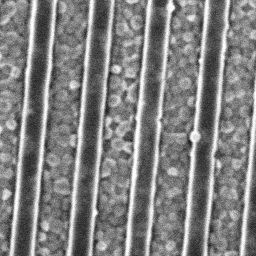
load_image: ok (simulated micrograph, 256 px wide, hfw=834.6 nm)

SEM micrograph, parallel lines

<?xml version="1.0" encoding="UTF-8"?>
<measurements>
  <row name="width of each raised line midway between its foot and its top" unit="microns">0.0731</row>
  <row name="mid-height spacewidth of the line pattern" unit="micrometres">0.113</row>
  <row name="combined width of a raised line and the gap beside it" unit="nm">187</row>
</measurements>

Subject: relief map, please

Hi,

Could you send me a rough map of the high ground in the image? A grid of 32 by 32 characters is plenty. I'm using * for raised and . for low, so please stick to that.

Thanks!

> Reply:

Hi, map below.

....***....***.....***....***...
....***....***....***.....**....
....***....***....***.....**....
....***....***....***....***....
....***....***....***....***....
....***....***....***....***....
....**.....***....***....***....
....**.....***....***....***....
...***.....***....***....***....
...***.....**.....***....***....
...***....***.....**.....***....
...***....***.....**.....***....
...***....***....***.....**.....
...***....***....***.....**.....
...***....***....***.....**.....
...***....***....***....***.....
...***....***....***....***....*
...**.....***....***....***....*
...**.....***....***....***....*
..***.....***....***....***....*
..***.....**.....***....***....*
..***....***.....**.....***....*
..***....***.....**.....***....*
..***....***....***.....***....*
..***....***....***.....**.....*
..***....***....***.....**.....*
..***....***....***....***.....*
..***....***....***....***....**
..**.....***....***....***....**
..**.....***....***....***....**
.***.....***....***....***....**
.***.....**.....***....***....**